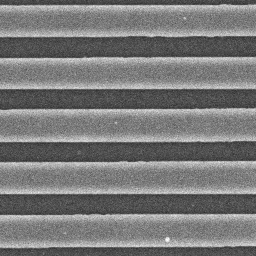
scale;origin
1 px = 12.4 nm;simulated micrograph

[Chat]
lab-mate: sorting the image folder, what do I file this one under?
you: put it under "lines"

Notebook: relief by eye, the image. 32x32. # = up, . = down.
................................
################################
################################
################################
###.............................
................................
................................
################################
################################
################################
################################
................................
................................
................................
################################
################################
################################
################################
................................
................................
################################
################################
################################
################################
................................
................................
................................
################################
################################
################################
################################
................................